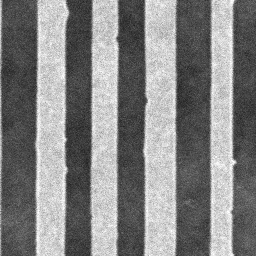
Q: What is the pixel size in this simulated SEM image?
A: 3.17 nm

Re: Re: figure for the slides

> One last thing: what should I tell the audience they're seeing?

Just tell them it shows parallel lines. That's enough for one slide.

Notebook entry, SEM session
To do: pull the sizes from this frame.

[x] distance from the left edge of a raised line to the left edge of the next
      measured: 180 nanometers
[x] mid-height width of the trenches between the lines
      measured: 0.0991 um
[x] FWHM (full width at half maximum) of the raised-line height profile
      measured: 81.5 nm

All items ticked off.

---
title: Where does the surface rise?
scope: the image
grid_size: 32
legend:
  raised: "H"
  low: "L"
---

LLLLLHHHLLLLHHHLLLHHHHLLLLLHHLLL
LLLLLHHHLLLLHHHLLLHHHHLLLLLHHLLL
LLLLLHHHLLLLHHHLLLHHHHLLLLLHHLLL
LLLLLHHHLLLLHHHLLLHHHHLLLLLHHLLL
LLLLLHHHLLLLHHHLLLHHHHLLLLLHHLLL
LLLLLHHHLLLLHHHLLLHHHHLLLLLHHLLL
LLLLLHHHLLLLHHHLLLHHHHLLLLLHHLLL
LLLLLHHHLLLLHHHLLLHHHHLLLLLHHLLL
LLLLLHHHLLLLHHHLLLHHHHLLLLLHHLLL
LLLLLHHHLLLLHHHLLLHHHHLLLLLHHLLL
LLLLLHHHLLLLHHHLLLHHHHLLLLLHHLLL
LLLLLHHHLLLLHHHLLLHHHHLLLLLHHLLL
LLLLLHHHLLLLHHHLLLHHHHLLLLLHHLLL
LLLLLHHHLLLLHHLLLLHHHHLLLLLHHLLL
LLLLLHHHLLLLHHLLLLHHHHLLLLLHHLLL
LLLLLHHHLLLLHHLLLLHHHHLLLLHHHLLL
LLLLLHHHLLLLHHLLLLHHHHLLLLHHHLLL
LLLLLHHHLLLLHHLLLLHHHHLLLLHHHLLL
LLLLLHHHLLLLHHLLLLHHHHLLLLHHHLLL
LLLLLHHHLLLLHHLLLLHHHHLLLLHHHLLL
LLLLLHHHLLLLHHLLLLHHHHLLLLHHHLLL
LLLLLHHHLLLLHHHLLLHHHHLLLLHHHLLL
LLLLLHHHLLLLHHHLLLHHHHLLLLHHHLLL
LLLLLHHHLLLLHHHLLLHHHHLLLLHHHLLL
LLLLLHHHLLLLHHHLLLHHHHLLLLHHHLLL
LLLLLHHHLLLLHHHLLLHHHHLLLLHHHLLL
LLLLLHHHLLLLHHHLLLHHHHLLLLHHHLLL
LLLLLHHHLLLLHHHLLLHHHHLLLLHHHLLL
LLLLLHHHLLLLHHLLLLHHHHLLLLHHHLLL
LLLLLHHHLLLHHHHLLLHHHHLLLLHHHLLL
LLLLLHHHLLLHHHLLLLHHHHLLLLHHHLLL
LLLLLHHHLLLHHHLLLLHHHHLLLLHHHLLL